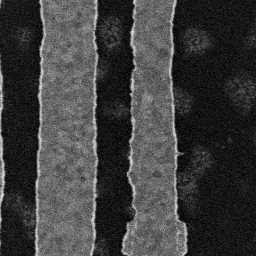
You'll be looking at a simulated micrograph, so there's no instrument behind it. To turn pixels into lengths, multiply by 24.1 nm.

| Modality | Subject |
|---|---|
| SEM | one or a few lines or trenches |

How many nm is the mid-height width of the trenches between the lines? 908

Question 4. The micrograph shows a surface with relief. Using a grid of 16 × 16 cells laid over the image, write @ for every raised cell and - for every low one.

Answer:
---@@@--@@@-----
---@@@--@@@-----
---@@@--@@@-----
---@@@--@@@-----
---@@@--@@@-----
---@@@--@@@-----
---@@@--@@@-----
---@@@--@@@-----
--@@@@--@@@-----
--@@@@--@@@-----
--@@@@--@@@-----
--@@@@--@@@-----
--@@@@--@@@-----
--@@@@--@@@-----
--@@@@--@@@@----
--@@@@--@@@@----